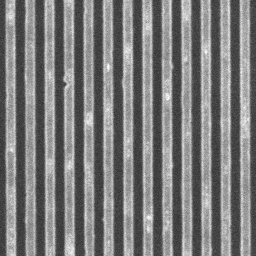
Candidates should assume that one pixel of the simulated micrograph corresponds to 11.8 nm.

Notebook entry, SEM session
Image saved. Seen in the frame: parallel lines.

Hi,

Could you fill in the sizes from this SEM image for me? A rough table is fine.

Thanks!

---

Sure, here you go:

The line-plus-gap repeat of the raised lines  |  230 nanometers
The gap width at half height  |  125 nm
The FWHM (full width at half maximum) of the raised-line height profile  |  101 nanometres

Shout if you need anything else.